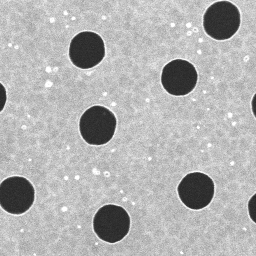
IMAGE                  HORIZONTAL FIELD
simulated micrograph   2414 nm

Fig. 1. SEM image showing holes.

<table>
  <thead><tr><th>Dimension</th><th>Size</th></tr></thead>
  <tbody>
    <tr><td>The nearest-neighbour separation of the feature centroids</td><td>720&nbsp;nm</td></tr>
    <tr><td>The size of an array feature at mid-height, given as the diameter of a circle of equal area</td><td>350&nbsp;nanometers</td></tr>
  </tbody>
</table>